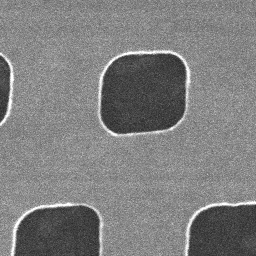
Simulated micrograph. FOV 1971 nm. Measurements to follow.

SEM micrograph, holes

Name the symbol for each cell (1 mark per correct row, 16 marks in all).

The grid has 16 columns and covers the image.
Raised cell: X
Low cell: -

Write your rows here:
XXXXXXXXXXXXXXXX
XXXXXXXXXXXXXXXX
XXXXXXXXXXXXXXXX
XXXXXXXX---XXXXX
-XXXXXX-----XXXX
-XXXXX------XXXX
-XXXXX------XXXX
XXXXXX-----XXXXX
XXXXXXXXXXXXXXXX
XXXXXXXXXXXXXXXX
XXXXXXXXXXXXXXXX
XXXXXXXXXXXXXXXX
XXXXXXXXXXXXXXXX
XX----XXXXXX----
X-----XXXXXX----
X-----XXXXXX----